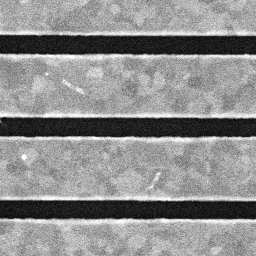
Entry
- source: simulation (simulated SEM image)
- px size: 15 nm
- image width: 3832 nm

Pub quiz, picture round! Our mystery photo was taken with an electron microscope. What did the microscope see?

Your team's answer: lines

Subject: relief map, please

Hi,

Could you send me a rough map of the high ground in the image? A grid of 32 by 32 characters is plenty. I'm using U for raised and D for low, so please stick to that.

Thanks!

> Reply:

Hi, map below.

UUUUUUUUUUUUUUUUUUUUUUUUUUUUUUUU
UUUUUUUUUUUUUUUUUUUUUUUUUUUUUUUU
UUUUUUUUUUUUUUUUUUUUUUUUUUUUUUUU
UUUUUUUUUUUUUUUUUUUUUUUUUUUUUUUU
DDDDDDDDDDDDDDDDDDDDDDDDDDDDDDDD
DDDDDDDDDDDDDDDDDDDDDDDDDDDDDDDD
DDDDDDDDDDDDDDDDDDDDDDDDDDDDDDDD
UUUUUUUUUUUUUUUUUUUUUUUUUUUUUUUU
UUUUUUUUUUUUUUUUUUUUUUUUUUUUUUUU
UUUUUUUUUUUUUUUUUUUUUUUUUUUUUUUU
UUUUUUUUUUUUUUUUUUUUUUUUUUUUUUUU
UUUUUUUUUUUUUUUUUUUUUUUUUUUUUUUU
UUUUUUUUUUUUUUUUUUUUUUUUUUUUUUUU
UUUUUUUUUUUUUUUUUUUUUUUUUUUUUUUU
UUUUUUUUUUUUUUUUUUUUUUUUUUUUUUUU
DDDDDDDDDDDDDDDDDDDDDDDDDDDDDDDD
DDDDDDDDDDDDDDDDDDDDDDDDDDDDDDDD
UUUUUUUUUUUUUUUUUUUUUUUUUUUUUUUU
UUUUUUUUUUUUUUUUUUUUUUUUUUUUUUUU
UUUUUUUUUUUUUUUUUUUUUUUUUUUUUUUU
UUUUUUUUUUUUUUUUUUUUUUUUUUUUUUUU
UUUUUUUUUUUUUUUUUUUUUUUUUUUUUUUU
UUUUUUUUUUUUUUUUUUUUUUUUUUUUUUUU
UUUUUUUUUUUUUUUUUUUUUUUUUUUUUUUU
UUUUUUUUUUUUUUUUUUUUUUUUUUUUUUUU
DDDDDDDDDDDDDDDDDDDDDDDDDDDDDDDD
DDDDDDDDDDDDDDDDDDDDDDDDDDDDDDDD
UUUUUUUUUUUUUUUUUUUUUUUUUUUUUUUU
UUUUUUUUUUUUUUUUUUUUUUUUUUUUUUUU
UUUUUUUUUUUUUUUUUUUUUUUUUUUUUUUU
UUUUUUUUUUUUUUUUUUUUUUUUUUUUUUUU
UUUUUUUUUUUUUUUUUUUUUUUUUUUUUUUU